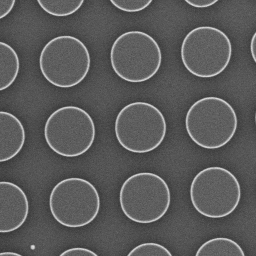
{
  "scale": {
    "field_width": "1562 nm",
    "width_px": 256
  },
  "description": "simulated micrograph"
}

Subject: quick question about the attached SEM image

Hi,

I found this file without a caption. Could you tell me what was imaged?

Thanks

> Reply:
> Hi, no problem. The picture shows an array of small figures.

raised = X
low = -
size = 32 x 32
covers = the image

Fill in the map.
XX---XXXXX----XXXXX-----XXX-----
X-----XXX-----------------------
--------------------------------
-------------------------XX-----
---------------XXXX----XXXXX----
X-----XXXX----XXXXXX---XXXXXX--X
XX---XXXXXX---XXXXXX---XXXXXX--X
XX---XXXXXX---XXXXXX---XXXXXX---
XX---XXXXXX---XXXXXX---XXXXX----
XX----XXXXX----XXXX------XX-----
X------XXX----------------------
--------------------------------
-------------------------XXX----
--------XX------XXX-----XXXXX---
XX----XXXXX----XXXXX---XXXXXX---
XXX---XXXXXX--XXXXXXX--XXXXXXX--
XXX---XXXXXX--XXXXXXX---XXXXX---
XXX---XXXXXX---XXXXX----XXXXX---
XXX---XXXXX-----XXX-------------
XX------X-----------------------
--------------------------------
-------------------------XXXX---
--------XX------XXXX----XXXXXX--
XX-----XXXXX---XXXXXX---XXXXXX--
XXX---XXXXXX---XXXXXX---XXXXXX--
XXX---XXXXXX---XXXXXX---XXXXXX--
XXX---XXXXXX----XXXXX----XXXX---
XXX----XXXXX-----XX-------------
XX------------------------------
--------------------------------
------------------X-------XXXX--
--------XXXX----XXXXX----XXXXX--